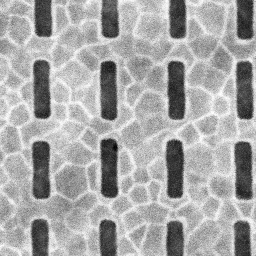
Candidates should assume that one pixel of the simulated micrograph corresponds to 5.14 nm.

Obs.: a regular array of holes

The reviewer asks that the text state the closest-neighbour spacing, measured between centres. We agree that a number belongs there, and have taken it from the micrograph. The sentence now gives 0.345 µm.